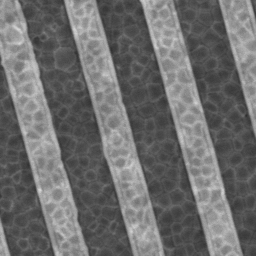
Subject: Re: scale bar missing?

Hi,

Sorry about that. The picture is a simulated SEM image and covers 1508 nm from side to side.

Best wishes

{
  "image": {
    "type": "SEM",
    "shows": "one or a few lines or trenches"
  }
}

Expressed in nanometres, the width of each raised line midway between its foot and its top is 172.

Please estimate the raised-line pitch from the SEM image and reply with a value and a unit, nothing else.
440 nanometres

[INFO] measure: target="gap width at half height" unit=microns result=0.269